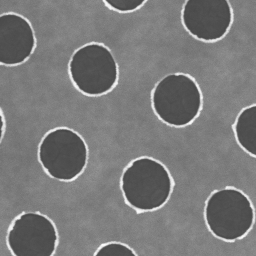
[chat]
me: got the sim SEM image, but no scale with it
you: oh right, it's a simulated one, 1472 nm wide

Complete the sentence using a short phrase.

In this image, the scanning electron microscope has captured holes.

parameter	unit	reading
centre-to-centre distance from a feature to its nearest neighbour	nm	508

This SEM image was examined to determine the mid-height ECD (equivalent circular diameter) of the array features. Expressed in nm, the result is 275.